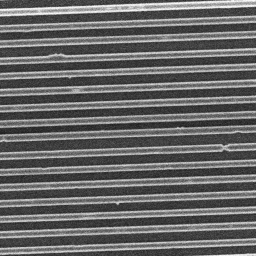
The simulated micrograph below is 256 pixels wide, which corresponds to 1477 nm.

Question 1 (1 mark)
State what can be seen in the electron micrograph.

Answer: parallel lines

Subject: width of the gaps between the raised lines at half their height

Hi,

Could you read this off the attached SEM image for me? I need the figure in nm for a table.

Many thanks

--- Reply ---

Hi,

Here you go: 54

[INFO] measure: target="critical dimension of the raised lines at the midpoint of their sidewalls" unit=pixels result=6.48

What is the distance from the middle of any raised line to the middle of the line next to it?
91.7 nanometers